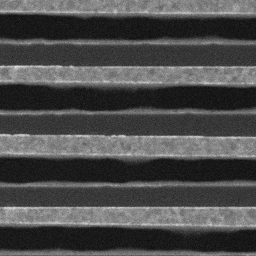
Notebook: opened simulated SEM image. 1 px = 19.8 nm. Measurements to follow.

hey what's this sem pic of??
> lines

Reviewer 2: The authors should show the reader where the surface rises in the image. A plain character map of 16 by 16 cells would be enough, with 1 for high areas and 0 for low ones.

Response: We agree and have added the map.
1111111111111111
0000000000000000
0000000000000000
1111111111111111
1111111111111111
0000000000000000
0000000000000000
1111111111111111
1111111111111111
1111111111111111
0000000000000000
0000000000000000
1111111111111111
1111111111111111
0000000000000000
0000000000000000